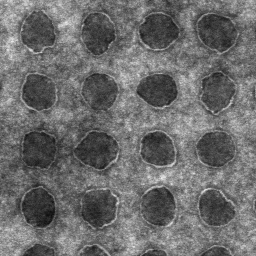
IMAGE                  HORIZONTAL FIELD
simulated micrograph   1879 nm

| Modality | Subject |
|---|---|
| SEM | a regular array of raised bodies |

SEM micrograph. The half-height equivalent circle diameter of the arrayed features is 0.282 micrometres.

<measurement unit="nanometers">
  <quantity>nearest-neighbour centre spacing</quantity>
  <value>423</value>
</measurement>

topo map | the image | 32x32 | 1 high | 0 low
00000000000000000000000000000000
00001100000000000000000000000000
00011100000111000011110001111000
00011110001111000111110001111100
00011110001111000111110001111100
00011110000111000011100000111000
00001000000110000000000000010000
00000000000000000000000000000000
00000000000000000000000000000000
00011100000111000011100000110000
00011110001111100111110001111000
00011110001111100111110001111000
00011110000111000011110001111000
00001100000111000000000000110000
00000000000000000000000000000000
00000000000000000000000000000000
00001100000110000001000000110000
00011110001111000011110001111000
00011110011111100111110001111000
00011110011111100011110001111000
00011100000111000001110001110000
00000000000000000000000000000000
00000000000000000000000000000000
00001000000000000001100000000000
00011110001111000011110001110000
00011110001111100011110001111000
00011110001111100011110001111000
00011110001111000011110001111000
00000100000000000000000000000000
00000000000000000000000000000000
00001000000000000000000000000000
00011110001110000011100000111000